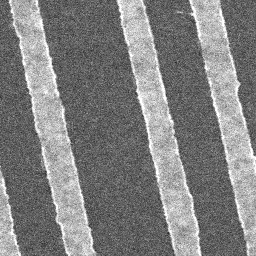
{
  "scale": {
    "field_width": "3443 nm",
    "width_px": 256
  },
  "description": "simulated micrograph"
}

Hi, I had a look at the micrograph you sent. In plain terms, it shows one or a few lines or trenches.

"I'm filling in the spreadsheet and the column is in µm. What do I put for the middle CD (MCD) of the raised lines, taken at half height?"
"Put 0.362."